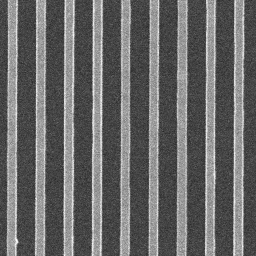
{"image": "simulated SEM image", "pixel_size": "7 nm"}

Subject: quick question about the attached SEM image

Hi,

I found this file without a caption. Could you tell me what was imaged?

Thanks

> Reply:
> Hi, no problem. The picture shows parallel lines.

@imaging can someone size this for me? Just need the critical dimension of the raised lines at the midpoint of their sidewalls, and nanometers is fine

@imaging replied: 57.8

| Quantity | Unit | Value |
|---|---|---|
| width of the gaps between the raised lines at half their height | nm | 140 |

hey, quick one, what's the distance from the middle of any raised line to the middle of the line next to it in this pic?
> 198 nm